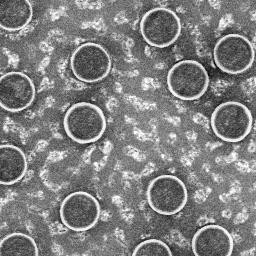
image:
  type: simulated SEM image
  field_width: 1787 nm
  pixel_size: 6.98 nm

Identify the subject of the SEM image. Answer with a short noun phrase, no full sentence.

a regular array of raised bodies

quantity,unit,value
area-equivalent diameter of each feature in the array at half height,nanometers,268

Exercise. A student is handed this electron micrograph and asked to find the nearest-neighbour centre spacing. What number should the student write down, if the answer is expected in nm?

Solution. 422